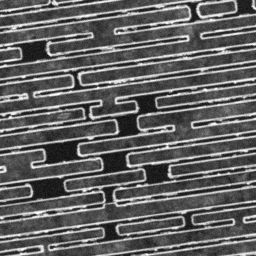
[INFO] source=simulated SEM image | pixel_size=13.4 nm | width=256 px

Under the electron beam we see parallel lines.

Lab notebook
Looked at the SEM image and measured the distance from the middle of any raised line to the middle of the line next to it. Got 229 nm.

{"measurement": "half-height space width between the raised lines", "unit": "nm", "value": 152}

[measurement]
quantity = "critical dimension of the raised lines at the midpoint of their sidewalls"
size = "71.2 nm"